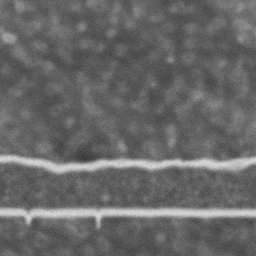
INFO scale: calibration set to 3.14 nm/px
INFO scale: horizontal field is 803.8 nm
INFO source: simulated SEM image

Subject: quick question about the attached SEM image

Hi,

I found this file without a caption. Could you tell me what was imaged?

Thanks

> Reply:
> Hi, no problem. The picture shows one or a few lines or trenches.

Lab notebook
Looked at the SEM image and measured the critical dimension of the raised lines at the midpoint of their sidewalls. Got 155 nanometers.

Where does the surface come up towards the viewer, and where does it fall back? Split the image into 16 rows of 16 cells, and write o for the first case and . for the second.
................
................
................
................
................
................
................
................
................
................
oooooooooooooooo
oooooooooooooooo
oooooooooooooooo
................
................
................